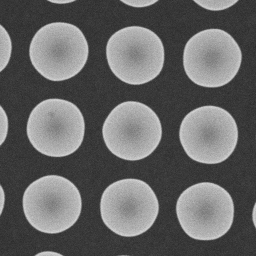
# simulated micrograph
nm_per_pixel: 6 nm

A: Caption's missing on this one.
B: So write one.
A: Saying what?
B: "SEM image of an array of small figures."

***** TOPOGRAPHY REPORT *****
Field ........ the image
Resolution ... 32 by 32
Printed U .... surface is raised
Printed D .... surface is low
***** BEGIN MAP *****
DDDDDDDDDDDDDDDDUUUDDDDDDUUUUDDD
DDDDDDDDDDDDDDDDDDDDDDDDDDDDDDDD
DDDDDDDDDDDDDDDDDDDDDDDDDDDDDDDD
DDDDDUUUUUDDDDDDUUDDDDDDDDDDDDDD
UDDDUUUUUUDDDDUUUUUUDDDDUUUUUDDD
UDDDUUUUUUUDDUUUUUUUDDDUUUUUUUDD
UDDDUUUUUUUDDUUUUUUUUDDUUUUUUUDD
UDDDUUUUUUUDDUUUUUUUDDDUUUUUUUDD
UDDDUUUUUUDDDDUUUUUUDDDUUUUUUUDD
DDDDDUUUUDDDDDUUUUUUDDDDUUUUUDDD
DDDDDDDDDDDDDDDDUUDDDDDDDUUUDDDD
DDDDDDDDDDDDDDDDDDDDDDDDDDDDDDDD
DDDDDDUUDDDDDDDDDDDDDDDDDDDDDDDD
DDDDUUUUUUDDDDUUUUUDDDDDDUUUDDDD
UDDDUUUUUUDDDDUUUUUUDDDUUUUUUDDD
UDDUUUUUUUUDDUUUUUUUDDDUUUUUUDDD
UDDUUUUUUUUDDUUUUUUUDDDUUUUUUUDD
UDDDUUUUUUDDDUUUUUUUDDDUUUUUUUDD
DDDDUUUUUUDDDDUUUUUDDDDUUUUUUDDD
DDDDDDUUDDDDDDDUUUDDDDDDUUUUUDDD
DDDDDDDDDDDDDDDDDDDDDDDDDDDDDDDD
DDDDDDDDDDDDDDDDDDDDDDDDDDDDDDDD
DDDDDUUUDDDDDDDUUDDDDDDDDDDDDDDD
DDDUUUUUUUDDDUUUUUUDDDDDUUUUDDDD
UDDUUUUUUUDDDUUUUUUDDDDUUUUUUDDD
DDDUUUUUUUDDDUUUUUUUDDUUUUUUUDDD
DDDUUUUUUUDDDUUUUUUUDDUUUUUUUDDD
DDDUUUUUUUDDDUUUUUUDDDUUUUUUUDDD
DDDDUUUUUDDDDDUUUUUDDDDUUUUUUDDD
DDDDDDDDDDDDDDDDUDDDDDDDUUUUDDDD
DDDDDDDDDDDDDDDDDDDDDDDDDDDDDDDD
DDDDDUDDDDDDDDDDDDDDDDDDDDDDDDDD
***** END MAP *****